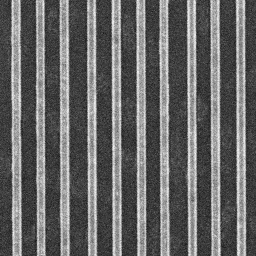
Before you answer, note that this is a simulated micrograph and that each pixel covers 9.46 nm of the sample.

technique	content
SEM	parallel lines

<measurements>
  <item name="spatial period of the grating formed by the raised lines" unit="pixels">25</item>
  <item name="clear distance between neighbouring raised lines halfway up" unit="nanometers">172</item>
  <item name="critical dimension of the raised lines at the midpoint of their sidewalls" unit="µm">0.0603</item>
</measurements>